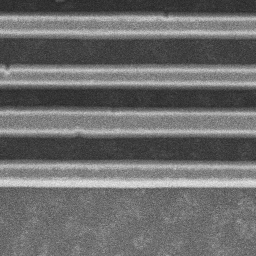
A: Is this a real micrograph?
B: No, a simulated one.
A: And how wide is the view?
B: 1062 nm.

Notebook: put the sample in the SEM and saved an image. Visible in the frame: parallel lines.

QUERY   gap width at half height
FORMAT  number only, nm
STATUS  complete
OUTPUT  116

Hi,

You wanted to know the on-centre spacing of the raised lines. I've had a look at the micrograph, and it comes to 205 nm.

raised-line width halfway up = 87.2 nm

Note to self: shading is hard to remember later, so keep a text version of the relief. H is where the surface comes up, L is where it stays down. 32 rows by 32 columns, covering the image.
LLLLLLLLLLLLLLLLLLLLLLLLLLLLLLLL
LLLLLLLLLLLLLLLLLLLLLLLLLLLLLLLL
HHHHHHHHHHHHHHHHHHHHHHHHHHHHHHHH
HHHHHHHHHHHHHHHHHHHHHHHHHHHHHHHH
LLLLLLLLLLLLLLLLLLLLLLLLLLLLLLLL
LLLLLLLLLLLLLLLLLLLLLLLLLLLLLLLL
LLLLLLLLLLLLLLLLLLLLLLLLLLLLLLLL
LLLLLLLLLLLLLLLLLLLLLLLLLLLLLLLL
HHHHHHHHHHHHHHLLLHHHHHHHHHHHHHHH
HHHHHHHHHHHHHHHHHHHHHHHHHHHHHHHH
HHHHHHHHHHHHHHHHHHHHHHHHHHHHHHHH
LLLLLLLLLLLLLLLLLLLLLLLLLLLLLLLL
LLLLLLLLLLLLLLLLLLLLLLLLLLLLLLLL
LLLLLLLLLLLLLLLLLLLLLLLLLLLLLLLL
HHHHHHHHHHHHHHHHHHHHHHHHHHHHHHHH
HHHHHHHHHHHHHHHHHHHHHHHHHHHHHHHH
HHHHHHHHHHHHHHHHHHHHHHHHHHHHHHHH
LLLLLLLLLLLLLLLLLLLLLLLLLLLLLLLL
LLLLLLLLLLLLLLLLLLLLLLLLLLLLLLLL
LLLLLLLLLLLLLLLLLLLLLLLLLLLLLLLL
HHHHHHHHHHHHHHHHHHHHHHHHHHHHHHHL
HHHHHHHHHHHHHHHHHHHHHHHHHHHHHHHH
HHHHHHHHHHHHHHHHHHHHHHHHHHHHHHHH
LLLLLLLLLLLLLLLLLLLLLLLLLLLLLLLL
LLLLLLLLLLLLLLLLLLLLLLLLLLLLLLLL
LLLLLLLLLLLLLLLLLLLLLLLLLLLLLLLL
LLLLLLLLLLLLLLLLLLLLLLLLLLLLLLLL
LLLLLLLLLLLLLLLLLLLLLLLLLLLLLLLL
LLLLLLLLLLLLLLLLLLLLLLLLLLLLLLLL
LLLLLLLLLLLLLLLLLLLLLLLLLLLLLLLL
LLLLLLLLLLLLLLLLLLLLLLLLLLLLLLLL
LLLLLLLLLLLLLLLLLLLLLLLLLLLLLLLL